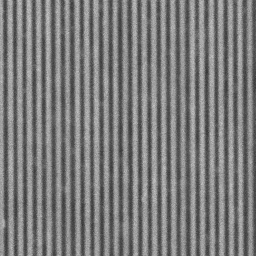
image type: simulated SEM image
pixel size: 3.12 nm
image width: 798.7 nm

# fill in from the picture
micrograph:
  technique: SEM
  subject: parallel lines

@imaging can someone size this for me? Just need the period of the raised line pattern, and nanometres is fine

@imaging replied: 29.9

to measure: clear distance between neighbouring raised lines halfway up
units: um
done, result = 0.0176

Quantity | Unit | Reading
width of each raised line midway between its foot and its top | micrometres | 0.0144